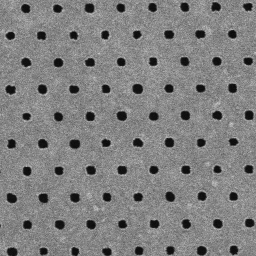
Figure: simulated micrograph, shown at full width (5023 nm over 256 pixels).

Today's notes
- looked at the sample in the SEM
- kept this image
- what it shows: a regular array of holes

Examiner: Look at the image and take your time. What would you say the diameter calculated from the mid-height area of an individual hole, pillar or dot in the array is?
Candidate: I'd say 187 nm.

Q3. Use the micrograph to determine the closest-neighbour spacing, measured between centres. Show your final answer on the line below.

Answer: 608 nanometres